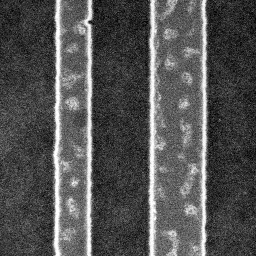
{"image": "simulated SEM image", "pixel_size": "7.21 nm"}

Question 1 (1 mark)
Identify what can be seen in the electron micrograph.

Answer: one or a few lines or trenches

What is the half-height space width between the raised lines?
445 nm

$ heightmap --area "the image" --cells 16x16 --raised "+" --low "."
....++....+++...
....++....+++...
....++...++++...
....++...++++...
....++...++++...
....++...++++...
....++...++++...
....++...++++...
....++...++++...
...+++...++++...
....++...++++...
....++...++++...
....++...++++...
....++...++++...
....++...++++...
....++...++++...